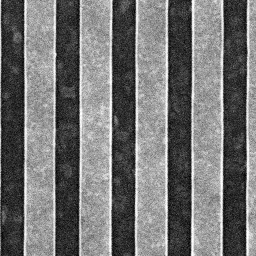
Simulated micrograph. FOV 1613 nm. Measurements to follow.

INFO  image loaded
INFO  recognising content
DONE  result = parallel lines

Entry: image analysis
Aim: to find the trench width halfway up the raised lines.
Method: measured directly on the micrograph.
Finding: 161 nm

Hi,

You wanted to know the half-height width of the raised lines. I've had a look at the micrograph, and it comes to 0.191 µm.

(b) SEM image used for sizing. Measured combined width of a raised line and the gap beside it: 352 nm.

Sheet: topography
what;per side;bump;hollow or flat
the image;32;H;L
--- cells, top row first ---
LLLHHHHLLLHHHHLLLHHHHLLLHHHHLLLH
LLLHHHHLLLHHHHLLLHHHHLLLHHHHLLLH
LLLHHHHLLLHHHHLLLHHHHLLLHHHHLLLH
LLLHHHHLLLHHHHLLLHHHHLLLHHHHLLLH
LLLHHHHLLLHHHHLLLHHHHLLLHHHHLLLH
LLLHHHHLLLHHHHLLLHHHHLLLHHHHLLLH
LLLHHHHLLLHHHHLLLHHHHLLLHHHHLLLH
LLLHHHHLLLHHHHLLLHHHHLLLHHHHLLLH
LLLHHHHLLLHHHHLLLHHHHLLLHHHHLLLH
LLLHHHHLLLHHHHLLLHHHHLLLHHHHLLLH
LLLHHHHLLLHHHHLLLHHHHLLLHHHHLLLH
LLLHHHHLLLHHHHLLLHHHHLLLHHHHLLLH
LLLHHHHLLLHHHHLLLHHHHLLLHHHHLLLH
LLLHHHHLLLHHHHLLLHHHHLLLHHHHLLLH
LLLHHHHLLLHHHHLLLHHHHLLLHHHHLLLH
LLLHHHHLLLHHHHLLLHHHHLLLHHHHLLLH
LLLHHHHLLLHHHHLLLHHHHLLLHHHHLLLH
LLLHHHHLLLHHHHLLLHHHHLLLHHHHLLLH
LLLHHHHLLLHHHHLLLHHHHLLLHHHHLLLH
LLLHHHHLLLHHHHLLLHHHHLLLHHHHLLLH
LLLHHHHLLLHHHHLLLHHHHLLLHHHHLLLH
LLLHHHHLLLHHHHLLLHHHHLLLHHHHLLLH
LLLHHHHLLLHHHHLLLHHHHLLLHHHHLLLH
LLLHHHHLLLHHHHLLLHHHHLLLHHHHLLLH
LLLHHHHLLLHHHHLLLHHHHLLLHHHHLLLH
LLLHHHHLLLHHHHLLLHHHHLLLHHHHLLLH
LLLHHHHLLLHHHHLLLHHHHLLLHHHHLLLH
LLLHHHHLLLHHHHLLLHHHHLLLHHHHLLLH
LLLHHHHLLLHHHHLLLHHHHLLLHHHHLLLH
LLLHHHHLLLHHHHLLLHHHHLLLHHHHLLLH
LLLHHHHLLLHHHHLLLHHHHLLLHHHHLLLH
LLLHHHHLLLHHHHLLLHHHHLLLHHHHLLLH